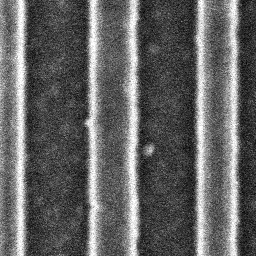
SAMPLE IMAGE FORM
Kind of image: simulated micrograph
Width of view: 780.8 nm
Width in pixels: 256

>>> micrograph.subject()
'one or a few lines or trenches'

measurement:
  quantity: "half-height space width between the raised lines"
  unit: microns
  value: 0.21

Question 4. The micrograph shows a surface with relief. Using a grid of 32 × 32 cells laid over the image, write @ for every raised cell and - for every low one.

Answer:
@@@---------@@@@@--------@@@@---
@@@---------@@@@@--------@@@@---
@@@---------@@@@@--------@@@@---
@@@---------@@@@@--------@@@@---
@@@---------@@@@@--------@@@@---
@@@---------@@@@@--------@@@@---
@@@---------@@@@@--------@@@@---
@@@---------@@@@@--------@@@@---
@@@---------@@@@@--------@@@@---
@@@---------@@@@@--------@@@@---
@@@---------@@@@@--------@@@@---
@@@---------@@@@@--------@@@@---
@@@---------@@@@@--------@@@@---
@@@---------@@@@@--------@@@@---
@@@---------@@@@@--------@@@@---
@@@--------@@@@@@--------@@@@---
@@@---------@@@@@--------@@@@---
@@@---------@@@@@--------@@@@---
@@@---------@@@@@--------@@@@---
@@@---------@@@@---------@@@@---
@@@---------@@@@---------@@@@---
@@@---------@@@@@--------@@@@---
@@----------@@@@@--------@@@@---
@@----------@@@@@--------@@@@---
@@----------@@@@@--------@@@@---
@@----------@@@@@--------@@@@---
@@@---------@@@@@--------@@@@---
@@@---------@@@@@--------@@@@---
@@----------@@@@@--------@@@@---
@@----------@@@@@--------@@@@---
@@----------@@@@@--------@@@@---
@@@---------@@@@@--------@@@@---